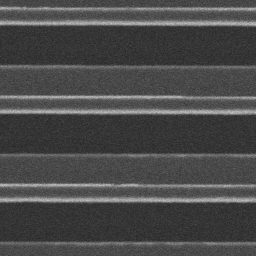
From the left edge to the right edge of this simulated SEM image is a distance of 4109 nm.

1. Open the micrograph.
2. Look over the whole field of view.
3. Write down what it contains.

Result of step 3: lines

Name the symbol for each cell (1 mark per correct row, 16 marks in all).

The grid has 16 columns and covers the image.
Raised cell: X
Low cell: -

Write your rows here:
XXXXXXXXXXXXXXXX
---XXX-XXXXXXXXX
----------------
----------------
XXXXXXXXXXXXXXXX
XXXXXXXXXXXXXXXX
XXXXXXXXXXXXXXXX
----------------
----------------
----------------
XXXXXXXXXXXXXXXX
XXXXXXXXXXXXXXXX
XXXXXXXXXXXXXXXX
----------------
----------------
XXXXXXXXXXXXXXXX